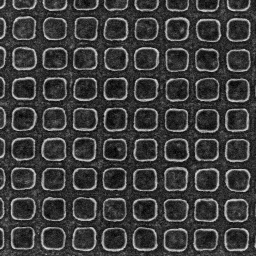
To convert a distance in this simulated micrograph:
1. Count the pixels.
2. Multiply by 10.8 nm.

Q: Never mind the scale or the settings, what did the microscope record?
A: a regular array of raised bodies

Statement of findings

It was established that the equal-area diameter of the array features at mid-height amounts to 264 nm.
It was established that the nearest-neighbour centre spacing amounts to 320 nm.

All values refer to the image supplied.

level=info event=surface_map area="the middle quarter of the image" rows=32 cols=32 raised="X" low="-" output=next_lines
--XXXXXX--XXXXXX--XXXXX---XXXXX-
--------------------XX----XXXX--
--------------------------------
--------------------------------
---XXXXX--XXXXXX--XXXXX---XXXXX-
---XXXXX--XXXXXX--XXXXX--XXXXXX-
---XXXXX--XXXXXX--XXXXX--XXXXXX-
X--XXXXX--XXXXXX--XXXXX--XXXXXX-
---XXXXX--XXXXX---XXXXX---XXXXX-
--------------------------------
--------------------------------
---XXXX----XXXX---XXXXX----XX---
--XXXXXX--XXXXXX--XXXXX--XXXXXX-
---XXXXX--XXXXXX--XXXXX--XXXXXX-
---XXXXX--XXXXXX--XXXXX--XXXXXX-
--XXXXXX--XXXXX---XXXXX--XXXXXX-
---XXXX----XXX------------XXXX--
--------------------------------
----XXX-------------------------
--XXXXXX--XXXXX---XXXXX---XXXXX-
--XXXXXX--XXXXXX--XXXXX--XXXXXX-
--XXXXXX--XXXXXX--XXXXX--XXXXXX-
--XXXXXX--XXXXXX--XXXXX--XXXXXX-
---XXXX---XXXXX---XXXXX--XXXXXX-
--------------------------------
--------------------------------
---XXXXX--XXXXX---XXXX----XXXXX-
--XXXXXX--XXXXX---XXXXX--XXXXXX-
--XXXXXX--XXXXX---XXXXX--XXXXXX-
--XXXXXX--XXXXX---XXXXX--XXXXXX-
---XXXXX--XXXXX---XXXXX--XXXXX--
------------------XXXX----XX----